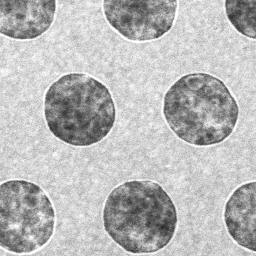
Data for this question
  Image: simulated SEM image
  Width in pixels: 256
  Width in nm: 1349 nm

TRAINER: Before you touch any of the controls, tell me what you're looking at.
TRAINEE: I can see holes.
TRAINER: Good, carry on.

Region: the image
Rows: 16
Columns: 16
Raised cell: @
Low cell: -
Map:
---@@@-----@@@--
---@@@@----@@@--
@@@@@@@@-@@@@@@@
@@@@@@@@@@@@@@@@
@@@@@@@@@@@@@@@@
@@@----@@@@---@@
@@@----@@@-----@
@@@----@@@-----@
@@@----@@@@---@@
@@@@@@@@@@@@@@@@
@@@@@@@@@@@@@@@@
--@@@@@@--@@@@@-
---@@@@----@@@--
---@@@-----@@@--
---@@@@----@@@--
--@@@@@@--@@@@@-